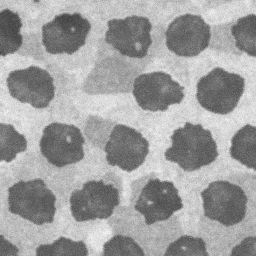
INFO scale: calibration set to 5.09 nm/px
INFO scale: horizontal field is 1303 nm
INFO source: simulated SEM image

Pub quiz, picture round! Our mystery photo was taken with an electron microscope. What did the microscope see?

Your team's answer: a regular array of holes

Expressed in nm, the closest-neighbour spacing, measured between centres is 316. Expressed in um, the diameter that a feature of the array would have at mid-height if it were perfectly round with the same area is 0.236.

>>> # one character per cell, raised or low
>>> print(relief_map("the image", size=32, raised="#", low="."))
################################
..##############################
...###.....###.....##.....####..
...##......##......##.....###...
...##......##......##......##...
...##......##......##.....###...
..####....#####....##....#####..
################################
###..######################.####
#......##########.....###.....##
#......##########......##......#
#......#########.......#.......#
##.....##########......##.....##
####..############...####.....##
################################
.#####...######.#######..#######
...##.....####...####......##...
...##......##.....###......##...
...##......##......##......##...
..###......##.....##.......##...
######...#####....####....####..
################.######.########
##.#.######..#####..#######.####
#.....####.....###....####....##
#......##......##......##......#
#......##......##......##......#
#......##.....###.....###......#
###....##....#####...#####.....#
################################
##############..#######.#######.
..###......##....####.....####..
..##.......##.....##......###...